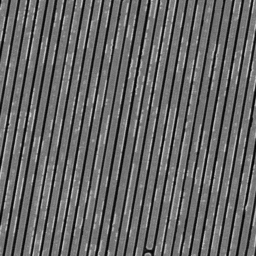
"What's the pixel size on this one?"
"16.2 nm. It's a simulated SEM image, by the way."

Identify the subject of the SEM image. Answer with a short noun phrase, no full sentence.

parallel lines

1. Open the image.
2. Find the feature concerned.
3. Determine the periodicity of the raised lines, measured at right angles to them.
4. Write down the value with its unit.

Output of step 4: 150 nm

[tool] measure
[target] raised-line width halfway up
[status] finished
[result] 106 nm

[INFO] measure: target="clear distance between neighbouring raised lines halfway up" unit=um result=0.046